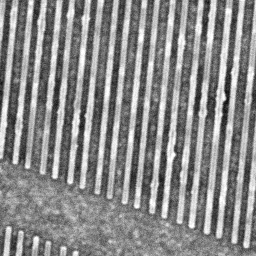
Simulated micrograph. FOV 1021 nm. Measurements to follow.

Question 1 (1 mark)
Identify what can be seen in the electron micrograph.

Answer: parallel lines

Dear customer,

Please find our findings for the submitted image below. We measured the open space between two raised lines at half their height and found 35.8 nm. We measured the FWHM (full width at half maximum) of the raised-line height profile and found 0.0174 micrometres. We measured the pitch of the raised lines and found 56.3 nm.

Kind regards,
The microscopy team